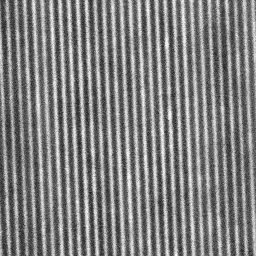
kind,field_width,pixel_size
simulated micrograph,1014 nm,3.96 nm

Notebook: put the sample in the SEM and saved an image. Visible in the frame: parallel lines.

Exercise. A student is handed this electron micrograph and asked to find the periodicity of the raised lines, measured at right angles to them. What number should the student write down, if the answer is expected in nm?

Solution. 34.7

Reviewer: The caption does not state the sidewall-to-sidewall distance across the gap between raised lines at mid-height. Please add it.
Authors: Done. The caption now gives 27.7 nm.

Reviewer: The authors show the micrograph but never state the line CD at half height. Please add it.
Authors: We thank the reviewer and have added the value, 6.9 nanometres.